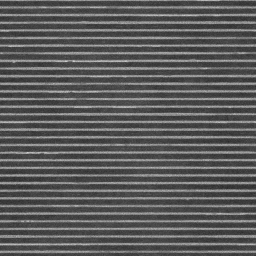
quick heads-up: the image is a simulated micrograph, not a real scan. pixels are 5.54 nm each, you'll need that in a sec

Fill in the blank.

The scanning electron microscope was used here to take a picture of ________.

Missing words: parallel lines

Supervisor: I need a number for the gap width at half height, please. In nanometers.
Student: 29.8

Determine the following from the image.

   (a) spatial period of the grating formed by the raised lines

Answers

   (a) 42.3 nm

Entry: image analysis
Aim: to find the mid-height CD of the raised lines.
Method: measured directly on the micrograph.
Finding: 14.5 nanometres